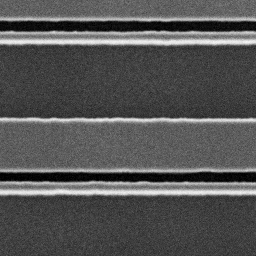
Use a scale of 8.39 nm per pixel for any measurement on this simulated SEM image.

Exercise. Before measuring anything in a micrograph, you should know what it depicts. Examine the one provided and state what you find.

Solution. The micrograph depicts lines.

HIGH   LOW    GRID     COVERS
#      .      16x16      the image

################
################
################
................
................
................
................
################
################
################
################
################
................
................
................
................